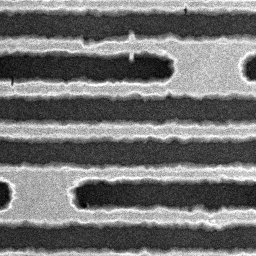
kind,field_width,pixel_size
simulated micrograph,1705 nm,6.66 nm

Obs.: parallel lines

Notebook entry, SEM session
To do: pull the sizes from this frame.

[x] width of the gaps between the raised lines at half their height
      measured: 25.9 px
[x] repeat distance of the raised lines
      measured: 282 nanometers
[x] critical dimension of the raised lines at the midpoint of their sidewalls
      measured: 0.109 micrometres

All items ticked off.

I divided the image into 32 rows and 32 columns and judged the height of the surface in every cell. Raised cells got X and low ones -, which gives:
XXXXXXXXXXXXXXXXXXXXXXXXXXXXXXXX
------X-XXX-XXX--XX-XXX--------X
--------------------------------
--------------------------------
----------------X----X----------
XXXXXXXXXXXXXXXXXXXXXXXXXXXXXXXX
XXXXXXXXXXXXXXXXXXXXXXXXXXXXXXXX
---------------------XXXXXXXXXX-
----------------------XXXXXXXX--
---------------------XXXXXXXXXX-
XXXXXXXXXXXXXXXXXXXXXXXXXXXXXXXX
XXXXXXXXXXXXXXXXXXXXXXXXXXXXXXXX
--------------------------------
--------------------------------
--------------------------------
XXXXXXXXXXX-XXXXXXX-XXXXX-X-XXXX
XXXXXXXXXXXXXXXXXXXXXXXXXXXXXXXX
---XXX----X---X-----X--X-XX-----
--------------------------------
--------------------------------
--------------------------------
XXXXXXXXXXXXXXXXXXXXXXXXXXXXXXXX
XXXXXXXXXXXXXXXXXXXXXXXXXXXXXXXX
-XXXXXXXXX----------------------
-XXXXXXXX-----------------------
-XXXXXXXX-----------------------
XXXXXXXXXXXXXXXXXXXXXXXXXX-XXXXX
XXXXXXXXXXXXXXXXXXXXXXXXXXXXXXXX
--------------------------XX----
--------------------------------
--------------------------------
XXXXXXXXXXXXXXXXXXXX-XXXXXXXXXXX